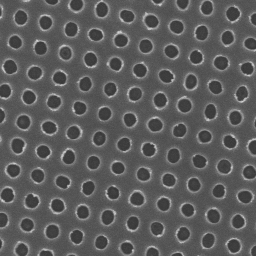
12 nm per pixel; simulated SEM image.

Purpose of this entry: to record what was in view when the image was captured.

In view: a regular array of holes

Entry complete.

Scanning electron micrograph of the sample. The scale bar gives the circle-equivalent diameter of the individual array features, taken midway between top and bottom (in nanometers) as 162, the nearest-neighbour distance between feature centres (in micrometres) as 0.296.